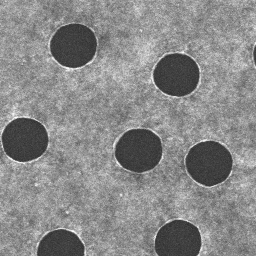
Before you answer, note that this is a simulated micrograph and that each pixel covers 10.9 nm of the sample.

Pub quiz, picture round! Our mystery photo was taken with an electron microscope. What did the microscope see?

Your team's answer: holes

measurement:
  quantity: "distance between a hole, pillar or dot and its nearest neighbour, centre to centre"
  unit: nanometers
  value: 926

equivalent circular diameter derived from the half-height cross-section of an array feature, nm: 506